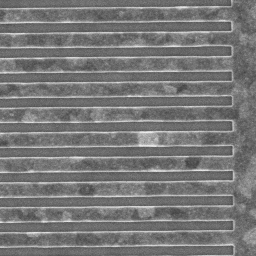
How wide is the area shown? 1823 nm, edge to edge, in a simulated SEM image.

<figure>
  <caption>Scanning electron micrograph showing groups of lines, slits or small figures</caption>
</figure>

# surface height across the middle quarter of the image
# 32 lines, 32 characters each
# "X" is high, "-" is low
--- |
XXXXXXXXXXXXXXXXXXXXXXXXXXXXXXXX
XXXXXXXXXXXXXXXXXXXXXXXXXXXXXXXX
--------------------------------
--------------------------------
---------------XXXXXXXXXXXXXXXXX
XXXXXXXXXXXXXXXXXXXXXXXXXXXXXXXX
XXXXXXXXXXXXXXXXXXXXXXXXXXXXXXXX
XXXXXXXXXXXXXXXXXXXXXXXXXXXXXXXX
--------------------------------
--------------------------------
--------------------------------
XXXXXXXXXXXXXXXXXXXXXXXXXXXXXXXX
XXXXXXXXXXXXXXXXXXXXXXXXXXXXXXXX
XXXXXXXXXXXXXXXXXXXXXXXXXXXXXXXX
--------------------------------
--------------------------------
--------------------------------
XXXXXXXXXXXXXXXXXXXXXXXXXXXXXXXX
XXXXXXXXXXXXXXXXXXXXXX-XXXXXXXXX
XXXXXXXXXXXXXXXXXXXXXXXXXXXXXXXX
XXXXXXXX---XXX------------------
--------------------------------
--------------------------------
XXXXXXXXXXXXXXX----XXXXXXXXXXXXX
XXXXXXXXXXXXXXXXXXXXXXXXXXXXXXXX
XXXXXXXXXXXXXXXXXXXXXXXXXXXXXXXX
XXXXXXXXXXXXXXXXXXXXXXXXXXXXXXXX
--------------------------------
--------------------------------
----------------------------XXXX
XXXXXXXXXXXXXXXXXXXXXXXXXXXXXXXX
X-XXXXXXXXXXXXXXXXXXXXXXXXXXXXXX